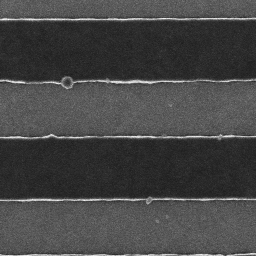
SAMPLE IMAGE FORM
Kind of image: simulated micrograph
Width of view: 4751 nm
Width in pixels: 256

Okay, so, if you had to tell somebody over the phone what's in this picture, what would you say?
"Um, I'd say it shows one or a few lines or trenches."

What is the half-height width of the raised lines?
1.18 microns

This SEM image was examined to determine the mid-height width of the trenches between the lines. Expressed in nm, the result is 1010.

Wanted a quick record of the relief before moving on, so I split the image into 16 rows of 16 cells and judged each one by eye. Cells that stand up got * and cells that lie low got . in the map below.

................
****************
****************
****************
****************
................
................
................
................
****************
****************
****************
**.**...**..*...
................
................
................